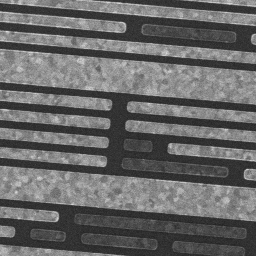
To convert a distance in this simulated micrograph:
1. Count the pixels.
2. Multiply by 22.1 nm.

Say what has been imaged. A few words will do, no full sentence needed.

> groups of lines, slits or small figures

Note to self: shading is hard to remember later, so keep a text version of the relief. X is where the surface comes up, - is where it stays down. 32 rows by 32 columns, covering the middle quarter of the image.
XXXXXXXXXXXXXXXXXXXXXXXXXXXXXXX-
XXXXXXXXXXXXXXXXXXXXXXXXXXXXXXXX
XXXXXXXXXXXXXXXXXXXXXXXXXXXXXXXX
XXXXXXXXXXXXXXXXXXXXXXXXXXXXXXXX
XXXXXXXXXXXXXXXXXXXXXXXXXXXXXXXX
XXXXXXXXXXXXXXXXXXXXXXXXXXXXXXXX
--------XXXXXXXXXXXXXXXXXXXXXXXX
--------------------XXXXXXXXXXXX
XXXXXX--------------------------
XXXXXXXXXXXX--------------------
XXXXXXXXXXXX----XXXXXXXXXXXXX---
----------------XXXXXXXXXXXXXXXX
-----------------------XXXXXXXXX
XXXXXXXX------------------------
XXXXXXXXXXX-----XXXX------------
----XXXXXXX-----XXXXXXXXXXXXXXX-
----------------XXXXXXXXXXXXXXXX
-------------------------XXXXXXX
XXXXXXXXXXX---------------------
XXXXXXXXXXX----XXXXXX-----------
------XXXXX----XXXXXXX----XXXXXX
----------------XXXXXX----XXXXXX
XX---------------------------XXX
XXXXXXXXXX----------------------
XXXXXXXXXX-----XXXXXXXXXX-------
--------XX-----XXXXXXXXXXXXXXXXX
-------------------XXXXXXXXXXXXX
XXXXX---------------------------
XXXXXXXXXXXXXXXXX---------------
XXXXXXXXXXXXXXXXXXXXXXXXXXX-----
XXXXXXXXXXXXXXXXXXXXXXXXXXXXXXXX
XXXXXXXXXXXXXXXXXXXXXXXXXXXXXXXX